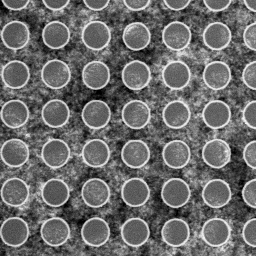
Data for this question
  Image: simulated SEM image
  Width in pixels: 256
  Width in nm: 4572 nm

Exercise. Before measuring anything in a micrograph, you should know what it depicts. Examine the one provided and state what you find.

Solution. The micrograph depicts a regular array of raised bodies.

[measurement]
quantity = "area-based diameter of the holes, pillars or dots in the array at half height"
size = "485 nm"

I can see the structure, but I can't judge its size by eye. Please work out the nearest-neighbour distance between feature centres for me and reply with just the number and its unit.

698 nanometers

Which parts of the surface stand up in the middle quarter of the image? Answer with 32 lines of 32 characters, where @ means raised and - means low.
@-----@@@@------@@@@@-----@@@@@-
@----@@@@@@----@@@@@@----@@@@@@-
@----@@@@@@----@@@@@@----@@@@@@-
@----@@@@@@----@@@@@@----@@@@@@-
@----@@@@@@----@@@@@@----@@@@@@-
------@@@@------@@@@------@@@@--
--------------------------------
--------------------------------
--------------------------------
-------@@--------@@--------@@---
@----@@@@@@-----@@@@@-----@@@@--
@----@@@@@@----@@@@@@----@@@@@@-
@----@@@@@@----@@@@@@----@@@@@@-
@----@@@@@@----@@@@@@----@@@@@@-
-----@@@@@@----@@@@@@----@@@@@@-
------@@@@------@@@@------@@@@--
--------------------------------
--------------------------------
--------------------------------
------@@@@------@@@--------@@@--
@----@@@@@@----@@@@@@-----@@@@@-
@----@@@@@@----@@@@@@----@@@@@@-
@----@@@@@@----@@@@@@----@@@@@@-
@----@@@@@@----@@@@@@----@@@@@@-
------@@@@@----@@@@@@----@@@@@@-
-------@@--------@@--------@@@--
--------------------------------
--------------------------------
--------------------------------
------@@@@------@@@@------@@@@--
@----@@@@@@----@@@@@@----@@@@@@-
@----@@@@@@----@@@@@@----@@@@@@-